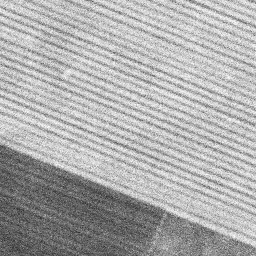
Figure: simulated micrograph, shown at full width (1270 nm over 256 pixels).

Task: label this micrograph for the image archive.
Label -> parallel lines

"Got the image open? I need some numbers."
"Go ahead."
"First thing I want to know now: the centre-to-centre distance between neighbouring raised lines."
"37.6 nm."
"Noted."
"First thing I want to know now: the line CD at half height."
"0.0241 microns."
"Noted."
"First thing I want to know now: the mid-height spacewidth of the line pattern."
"14.4 nm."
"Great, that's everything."